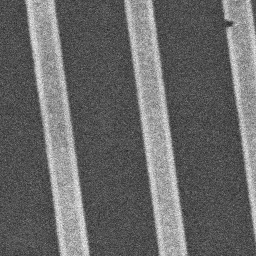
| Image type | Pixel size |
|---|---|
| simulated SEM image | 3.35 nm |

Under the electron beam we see one or a few lines or trenches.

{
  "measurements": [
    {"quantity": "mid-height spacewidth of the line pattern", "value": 0.252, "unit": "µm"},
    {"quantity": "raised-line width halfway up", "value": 74.7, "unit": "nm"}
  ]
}